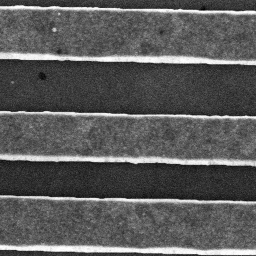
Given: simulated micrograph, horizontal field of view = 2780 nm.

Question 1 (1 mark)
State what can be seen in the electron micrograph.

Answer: lines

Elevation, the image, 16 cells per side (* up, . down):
******..........
****************
****************
****************
................
................
................
****************
****************
****************
................
................
***********.....
****************
****************
****************